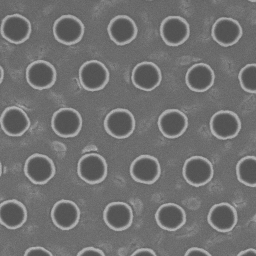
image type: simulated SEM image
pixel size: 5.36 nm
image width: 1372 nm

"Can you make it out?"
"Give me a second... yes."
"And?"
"a regular array of raised bodies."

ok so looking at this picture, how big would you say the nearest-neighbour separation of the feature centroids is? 0.281 micrometres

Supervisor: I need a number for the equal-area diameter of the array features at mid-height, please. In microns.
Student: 0.152